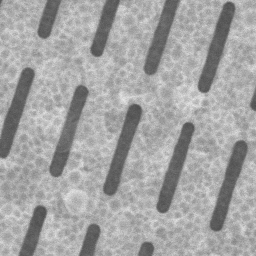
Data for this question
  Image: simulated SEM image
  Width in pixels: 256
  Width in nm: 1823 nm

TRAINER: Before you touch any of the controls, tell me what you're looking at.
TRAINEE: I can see holes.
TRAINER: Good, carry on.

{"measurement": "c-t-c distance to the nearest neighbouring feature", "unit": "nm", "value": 400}